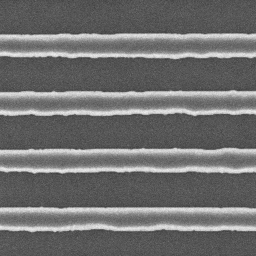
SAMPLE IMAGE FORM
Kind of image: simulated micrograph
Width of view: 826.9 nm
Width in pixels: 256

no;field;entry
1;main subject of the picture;lines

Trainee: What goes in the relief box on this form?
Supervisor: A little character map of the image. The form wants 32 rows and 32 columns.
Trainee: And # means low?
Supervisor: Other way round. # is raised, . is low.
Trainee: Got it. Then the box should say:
................................
................................
................................
................................
##.....######.##################
################################
################################
................................
................................
................................
................................
....................#####.#.##..
################################
################################
................................
................................
................................
................................
................................
################################
################################
................................
................................
................................
................................
................................
################################
################################
###########..#######.###########
................................
................................
................................